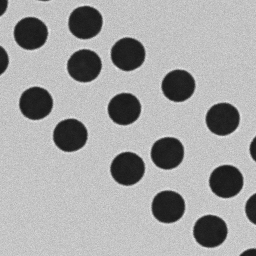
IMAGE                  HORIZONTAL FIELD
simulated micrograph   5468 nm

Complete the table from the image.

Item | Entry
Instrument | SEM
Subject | a regular array of holes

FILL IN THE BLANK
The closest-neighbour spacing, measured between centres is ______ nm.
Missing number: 1020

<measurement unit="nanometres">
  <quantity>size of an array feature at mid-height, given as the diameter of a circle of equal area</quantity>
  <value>736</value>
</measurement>